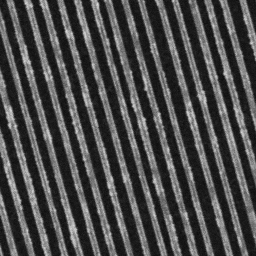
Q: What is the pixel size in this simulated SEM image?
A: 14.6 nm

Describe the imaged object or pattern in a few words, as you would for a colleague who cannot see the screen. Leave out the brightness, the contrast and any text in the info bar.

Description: parallel lines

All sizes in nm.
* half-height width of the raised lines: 82.8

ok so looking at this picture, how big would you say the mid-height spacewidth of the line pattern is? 144 nanometres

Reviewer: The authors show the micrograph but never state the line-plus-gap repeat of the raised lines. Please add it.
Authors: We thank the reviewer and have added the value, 15.9 px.